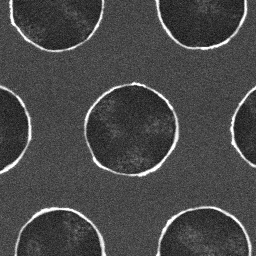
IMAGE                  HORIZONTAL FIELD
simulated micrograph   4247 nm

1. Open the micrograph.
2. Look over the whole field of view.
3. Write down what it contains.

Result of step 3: holes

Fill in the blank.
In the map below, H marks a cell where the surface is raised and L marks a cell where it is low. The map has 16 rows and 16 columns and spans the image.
HLLLLLHHHHLLLLLH
HLLLLLHHHHLLLLLH
HHLLLHHHHHHLLLHH
HHHHHHHHHHHHHHHH
HHHHHHHHHHHHHHHH
HHHHHHHLLHHHHHHH
LHHHHHLLLLHHHHHL
LLHHHLLLLLLHHHHL
LLHHHLLLLLLHHHHL
LHHHHHLLLLLHHHHL
HHHHHHHLLLHHHHHH
HHHHHHHHHHHHHHHH
HHHHHHHHHHHHHHHH
HHLLLHHHHHHLLLHH
HLLLLLHHHHLLLLLH
HLLLLLHHHHLLLLLL